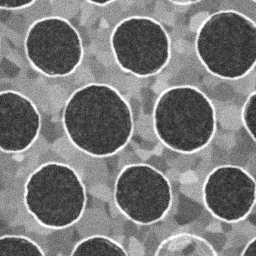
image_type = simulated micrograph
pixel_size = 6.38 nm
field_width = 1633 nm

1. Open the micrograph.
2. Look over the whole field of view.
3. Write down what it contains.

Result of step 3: holes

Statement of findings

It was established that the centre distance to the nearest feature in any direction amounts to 547 nanometers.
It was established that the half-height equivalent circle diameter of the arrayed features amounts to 381 nm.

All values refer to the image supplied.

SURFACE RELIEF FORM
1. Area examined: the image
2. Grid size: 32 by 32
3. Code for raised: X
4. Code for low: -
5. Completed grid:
----XXXXXXXXXXXXXXXXXXXXXXXXXXXX
XXXXXXXXXXXXXXXXXXXXXXXXXXXX-XXX
XXXXX---XXXXXXXX---XXXXXXX-----X
XXXX-----XXXXX------XXXXX-------
XXX-------XXXX-------XXXX-------
XXX-------XXXX-------XXXX-------
XXX----X--XXXX-------XXXX-------
XXXX------XXXXX------XXXX-------
XXXXX----XXXXXX-----XXXXXX-----X
XXXXXXXXXXXXXXXXXXXXXXXXXXXX--XX
XXXXXXXXXXXXXXXXXXXXXXXXXXXXXXXX
XXXXXXXXXX-----XXXXXX----XXXXXXX
----XXXXX------XXXXX------XXXXX-
----XXXX--------XXX--------XXX--
-----XXX--------XXX--------XXX--
-----XXX---------XX--------XXXX-
-----XXX--------XXXX-------XXXX-
----XXXXX-------XXXX------XXXXXX
---XXXXXXX-----XXXXXX----XXXXXXX
XXXXXXXXXXXX-XXXXXXXXXXXXXXXXXXX
XXXXXX-XXXXXXXXXXXXXXXXXXXXXXXXX
XXXXX----XXXXXX-----XXXXXXX----X
XXXX------XXXXX------XXXXX------
XXX-------XXXX-------XXXXX------
XXX--------XXX-------XXXXX------
XXX--------XXXX------XXXXX------
XXXX------XXXXX------XXXXXX----X
XXXXX----XXXXXXXX---XXXXXXXX--XX
XXXXXXXXXXXXXXXXXXXXXXXXXXXXXXXX
XXXXXXXXXXXXXXXXXXXXXXXXXXXXXXXX
----XXXXXX-----XXXXXXX--XXXXXXX-
-----XXXX-------XXXXX----XXXXXX-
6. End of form